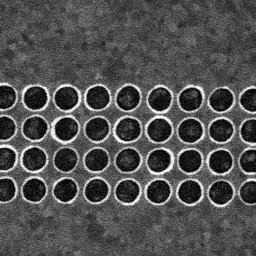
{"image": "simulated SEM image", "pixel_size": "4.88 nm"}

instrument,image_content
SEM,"a regular array of holes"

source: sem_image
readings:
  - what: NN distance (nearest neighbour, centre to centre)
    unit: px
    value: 30.6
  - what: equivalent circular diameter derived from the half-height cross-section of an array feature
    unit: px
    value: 24.3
